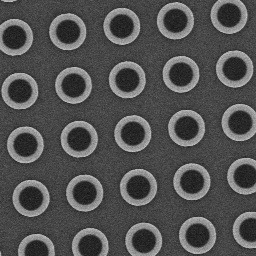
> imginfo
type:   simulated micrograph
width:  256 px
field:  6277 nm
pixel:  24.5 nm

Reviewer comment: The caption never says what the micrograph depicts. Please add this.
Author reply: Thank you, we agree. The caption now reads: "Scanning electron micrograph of an array of small figures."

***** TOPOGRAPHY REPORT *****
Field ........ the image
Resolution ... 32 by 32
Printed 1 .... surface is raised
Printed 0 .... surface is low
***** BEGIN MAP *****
00000000000000000000011000011100
00000000000000111000111100111110
01000001110001111000111100111110
11110011111001111000111100011100
11110011111001111000011000000000
11110001110000010000000000000000
11100000000000000000000000001100
00000000000000000000011100011110
00000000010000111100111110011111
01110001111000111100111110011110
11111001111000111100011110001110
11111001111000111100001000000000
11110000110000000000000000000000
00100000000000000000000000000110
00000000000000001000001110001111
00000000011000011110011111001111
00111000111100111110011111001111
01111000111100111110001110000110
01111000111100011100000000000000
01111000011000000000000000000000
00000000000000000000000010000111
00000000000000001110001111001111
00000000011100011110001111001111
00111100111110011111001111000111
00111100111110011110000110000000
00111100011100001100000000000000
00111000000000000000000000000001
00000000000000000000000111000111
00000000000000001110000111100111
00001100011110001111001111100111
00011110011111001111000111100011
00111110011110001111000011000000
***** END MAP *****